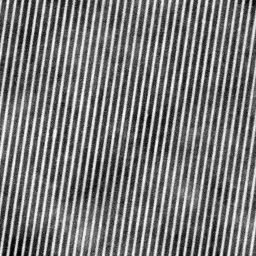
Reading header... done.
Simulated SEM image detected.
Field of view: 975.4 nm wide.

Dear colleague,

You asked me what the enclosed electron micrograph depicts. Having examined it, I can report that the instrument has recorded parallel lines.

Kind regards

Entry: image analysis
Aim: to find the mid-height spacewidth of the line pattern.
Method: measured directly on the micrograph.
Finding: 19.8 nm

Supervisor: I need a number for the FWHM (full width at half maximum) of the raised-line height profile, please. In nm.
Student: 7.5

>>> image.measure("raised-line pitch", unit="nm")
27.7